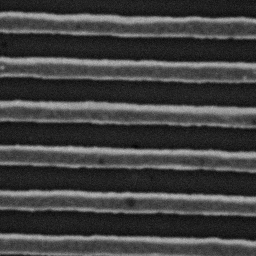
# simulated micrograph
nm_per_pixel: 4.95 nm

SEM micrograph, lines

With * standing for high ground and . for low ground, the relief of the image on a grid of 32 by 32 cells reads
................................
................................
**************************.****.
********************************
...............*****************
................................
................................
********........................
********************************
********************************
................................
................................
................................
********************............
********************************
...............*.....***********
................................
................................
****............................
********************************
********************************
................................
................................
................................
***********************.........
********************************
..............******************
................................
................................
*...............................
********************************
********************************